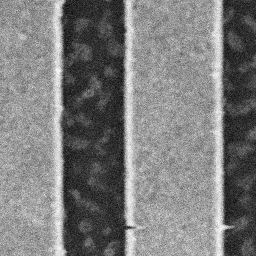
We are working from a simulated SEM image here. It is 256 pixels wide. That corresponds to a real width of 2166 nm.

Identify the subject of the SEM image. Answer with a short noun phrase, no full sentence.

one or a few lines or trenches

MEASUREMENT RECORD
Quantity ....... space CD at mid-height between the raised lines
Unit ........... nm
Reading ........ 606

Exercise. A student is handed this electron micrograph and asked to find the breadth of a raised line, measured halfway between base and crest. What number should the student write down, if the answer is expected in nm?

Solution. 756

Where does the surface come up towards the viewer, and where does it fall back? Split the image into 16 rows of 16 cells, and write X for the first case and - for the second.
XXXX----XXXXXX--
XXXX----XXXXXX--
XXXX----XXXXXX--
XXXX----XXXXXX--
XXXX----XXXXXX--
XXXX----XXXXXX--
XXXX----XXXXXX--
XXXX----XXXXXX--
XXXX----XXXXXX--
XXXX----XXXXXX--
XXXX----XXXXXX--
XXXX----XXXXXX--
XXXX----XXXXXX--
XXXX----XXXXXX--
XXXX----XXXXXX--
XXXX----XXXXXX--